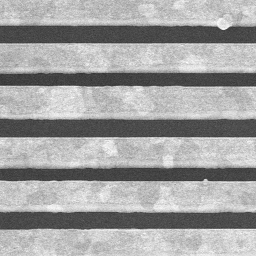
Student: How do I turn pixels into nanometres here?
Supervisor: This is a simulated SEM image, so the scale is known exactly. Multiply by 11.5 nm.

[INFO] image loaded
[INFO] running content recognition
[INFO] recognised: lines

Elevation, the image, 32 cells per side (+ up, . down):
++++++++++++++++++++++++++++++++
++++++++++++++++++++++++++++++++
++++++++++++++++++++++++++++++++
................................
................................
................................
++++++++++++++++++++++++++++++++
++++++++++++++++++++++++++++++++
++++++++++++++++++++++++++++++++
................................
................................
++++++++++++++++++++++++++++++++
++++++++++++++++++++++++++++++++
++++++++++++++++++++++++++++++++
++++++++++++++++++++++++++++++++
................................
................................
++++++++++++++++++++++++++++++++
++++++++++++++++++++++++++++++++
++++++++++++++++++++++++++++++++
++++++++++++++++++++++++++++++++
................................
................................
++++++++++++++++++++++++++++++++
++++++++++++++++++++++++++++++++
++++++++++++++++++++++++++++++++
................................
................................
................................
++++++++++++++++++++++++++++++++
++++++++++++++++++++++++++++++++
++++++++++++++++++++++++++++++++